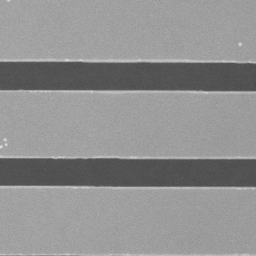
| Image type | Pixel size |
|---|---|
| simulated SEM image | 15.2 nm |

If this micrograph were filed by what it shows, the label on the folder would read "lines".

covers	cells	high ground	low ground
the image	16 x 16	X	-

XXXXXXXXXXXXXXXX
XXXXXXXXXXXXXXXX
XXXXXXXXXXXXXXXX
XXXXXXXXXXXXXXXX
----------------
----------------
XXXXXXXXXXXXXXXX
XXXXXXXXXXXXXXXX
XXXXXXXXXXXXXXXX
XXXXXXXXXXXXXXXX
----------------
----------------
XXXXXXXXXXXXXXXX
XXXXXXXXXXXXXXXX
XXXXXXXXXXXXXXXX
XXXXXXXXXXXXXXXX